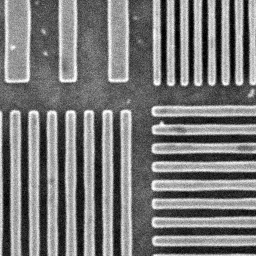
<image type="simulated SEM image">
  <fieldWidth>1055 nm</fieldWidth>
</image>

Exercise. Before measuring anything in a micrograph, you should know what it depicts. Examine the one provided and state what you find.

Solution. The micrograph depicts groups of lines, slits or small figures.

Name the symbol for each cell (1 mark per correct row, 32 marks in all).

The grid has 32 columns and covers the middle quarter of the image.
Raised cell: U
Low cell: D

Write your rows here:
UUUDDDDDDDDUUUUUDDDDDDUUDDUDDUUD
UUUDDDDDDDDUUUUUDDDDDDUUDDUDDUUD
UUUDDDDDDDDUUUUUDDDDDDUUDDUDDUUD
UUUDDDDDDDDUUUUUDDDDDDUUDDUDDUUD
DDDDDDDDDDDDDDDDDDDDDDUUDDUDDUUD
DDDDDDDDDDDDDDDDDDDDDDDDDDDDDDDD
DDDDDDDDDDDDDDDDDDDDDDDDDDDDDDDD
DDDDDDDDDDDDDDDDDDDDDDDDDDDDDDDD
DDDDDDDDDDDDDDDDDDDDDDDDDDDDDDDD
DDDDDDDDDDDDDDDDDDDDDDDDDDDDDDDD
DDDDDDDDDDDDDDDDDDDDDDDDDDDDDDDD
DDDDDDDDDDDDDDDDDDDDDDUUUUUUUUUU
DUUDDUUDDDUUDDUUUDDDDDUUUUUUUUUU
DUUDDUUDDDUUDDUUUDDDDDDDDDDDDDDD
DUUDDUUDDDUUDDUUUDDDDDDDDDDDDDDD
DUUDDUUDDDUUDDUUUDDDDDUUUUUUUUUU
DUUDDUUDDDUUDDUUUDDDDDUUUUUUUUUU
DUUDDUUDDDUUDDUUUDDDDDDUUUUUUUUU
DUUDDUUDDDUUDDUUUDDDDDDDDDDDDDDD
DUUDDUUDDDUUDDUUUDDDDDDDDDDDDDDD
DUUDDUUDDDUUDDUUUDDDDDUUUUUUUUUU
DUUDDUUDDDUUDDUUUDDDDDUUUUUUUUUU
DUUDDUUDDDUUDDDUUDDDDDDDDDDDDDDD
DUUDDUUDDDUUDDDUUDDDDDDDDDDDDDDD
DUUDDUUDDDUUDDUUUDDDDDDDDDDDDDDD
UUUDDUUDDDUUDDUUUDDDDDUUUUUUUUUU
UUUDDUUDDDUUDDUUUDDDDDUUUUUUUUUU
UUUDDUUDDDUUDDUUUDDDDDDDDDDDDDDD
UUUDDUUDDDUUDDUUUDDDDDDDDDDDDDDD
UUUDDUUDDDUUDDUUUDDDDDUUUUUUUUUU
UUUDDUUDDDUUDDUUUDDDDDUUUUUUUUUU
DUUDDUUDDDUUDDUUUDDDDDDDDDDDDDDD